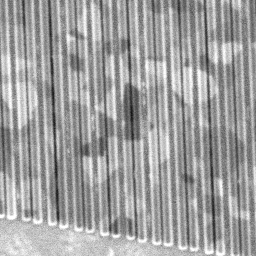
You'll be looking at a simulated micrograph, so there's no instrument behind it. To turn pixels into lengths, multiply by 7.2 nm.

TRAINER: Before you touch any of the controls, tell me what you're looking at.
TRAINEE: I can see parallel lines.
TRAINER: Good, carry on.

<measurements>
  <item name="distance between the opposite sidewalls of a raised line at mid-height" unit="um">0.0513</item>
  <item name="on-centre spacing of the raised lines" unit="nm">93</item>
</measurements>